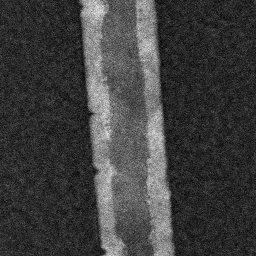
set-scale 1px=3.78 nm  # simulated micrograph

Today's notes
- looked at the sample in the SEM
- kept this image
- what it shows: one or a few lines or trenches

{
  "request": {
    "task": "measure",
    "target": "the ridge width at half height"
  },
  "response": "204 nm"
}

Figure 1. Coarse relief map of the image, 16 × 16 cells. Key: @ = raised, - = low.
------@@@-------
------@@@-------
------@@@-------
------@@@-------
------@@@-------
------@@@-------
------@@@@------
------@@@@------
------@@@@------
------@@@@------
-------@@@------
-------@@@------
-------@@@------
-------@@@------
-------@@@------
-------@@@------